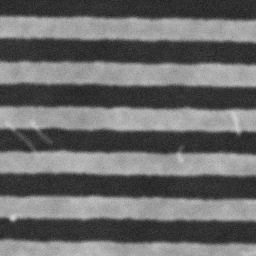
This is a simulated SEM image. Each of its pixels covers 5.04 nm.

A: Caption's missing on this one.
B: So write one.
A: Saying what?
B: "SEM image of lines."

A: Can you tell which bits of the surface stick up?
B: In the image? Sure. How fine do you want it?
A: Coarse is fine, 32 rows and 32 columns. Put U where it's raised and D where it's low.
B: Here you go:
DDDDDDDDDDDDDDDDDDDDDDDDDDDDDDDD
DDDDDDDDDDDDDDDDDDDDDDDDDDDDDDDD
UUUUUUUUUUUUUUUUUUUUUUUUUDDDDDDD
UUUUUUUUUUUUUUUUUUUUUUUUUUUUUUUU
UUUUUUUUUUUUUUUUUUUUUUUUUUUUUUUU
DDDDDDDDDDDDDDDDDDDDDDDDDDDDDDDD
DDDDDDDDDDDDDDDDDDDDDDDDDDDDDDDD
DDDDDDDDDDDDDDDDDDDDDDDDDDDDDDDD
UUUUUUUUUUUUUUUUUUUUUUUUUUUUUUUU
UUUUUUUUUUUUUUUUUUUUUUUUUUUUUUUU
DDDDDDDDDDDDDUUUUUUUUDDUUUUUUUUU
DDDDDDDDDDDDDDDDDDDDDDDDDDDDDDDD
DDDDDDDDDDDDDDDDDDDDDDDDDDDDDDDD
UUUUUUDUUUUDDDDUDDDDDDDDDDDDDDDD
UUUUUUUUUUUUUUUUUUUUUUUUUUUUUUUU
UUUUUUUUUUUUUUUUUUUUUUUUUUUUUUUU
DDDDDDDDDDDDDDDDDDDDDDDDDDDDDDDD
DDDDDDDDDDDDDDDDDDDDDDDDDDDDDDDD
DDDDDDDDDDDDDDDDDDDDDDDDDDDDDDDD
UUUUUUUUUUUUUUUUUUUUUUUUUUUUUUUU
UUUUUUUUUUUUUUUUUUUUUUUUUUUUUUUU
UUUUUDUUUUUUUUUUUUUUUUUUUUUUUUUU
DDDDDDDDDDDDDDDDDDDDDDDDDDDDDDDD
DDDDDDDDDDDDDDDDDDDDDDDDDDDDDDDD
DDDDDDDDDDDDDDDDDDDDDDDDDDDDDDDD
UUUUUUUUUUUUUUUUUUUUUUUUUUUUUUUU
UUUUUUUUUUUUUUUUUUUUUUUUUUUUUUUU
DDDDDDDDDDDDDDDDDDDDDDDDDDDDDDUD
DDDDDDDDDDDDDDDDDDDDDDDDDDDDDDDD
DDDDDDDDDDDDDDDDDDDDDDDDDDDDDDDD
UUUUUUUUUUUUUUUDDDUUUUUUDDDDDDDD
UUUUUUUUUUUUUUUUUUUUUUUUUUUUUUUU